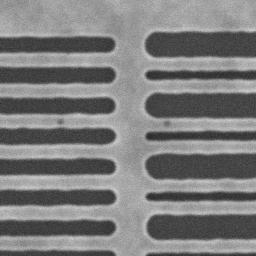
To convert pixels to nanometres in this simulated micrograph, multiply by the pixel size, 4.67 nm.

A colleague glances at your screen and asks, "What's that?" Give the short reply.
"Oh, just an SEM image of groups of lines, slits or small figures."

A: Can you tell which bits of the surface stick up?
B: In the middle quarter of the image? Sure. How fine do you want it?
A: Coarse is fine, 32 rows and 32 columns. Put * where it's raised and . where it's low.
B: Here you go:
********************************
.............*********..********
.............*******............
.............********...........
............********************
********************************
********************************
**********************..........
............*********...........
.............*******............
.............*******............
.............*******............
............*********...........
***********************.........
********************************
********************************
............********************
.............*******............
.............*******............
............********************
********************************
********************************
***********************.........
**........***********...........
.............*******............
.............*******............
.............*******............
............*********...........
**********************..........
********************************
********************************
............********************